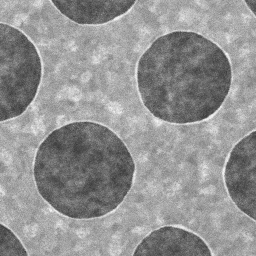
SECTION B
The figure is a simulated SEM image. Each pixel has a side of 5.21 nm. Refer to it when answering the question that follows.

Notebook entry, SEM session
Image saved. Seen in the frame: holes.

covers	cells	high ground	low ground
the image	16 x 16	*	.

****....********
*****.**********
..********...***
..*******.....**
...******.....**
..*******.....**
..*******.....**
**********...***
***....********.
**......******..
**......******..
**......******..
***.....*******.
****..**********
.*********..****
..*******....***